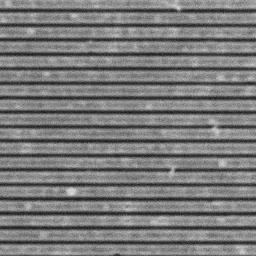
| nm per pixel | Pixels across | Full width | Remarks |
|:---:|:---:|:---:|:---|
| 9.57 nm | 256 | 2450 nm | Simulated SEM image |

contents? parallel lines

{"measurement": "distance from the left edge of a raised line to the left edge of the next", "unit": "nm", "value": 139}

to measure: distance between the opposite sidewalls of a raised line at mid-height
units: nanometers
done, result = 92.2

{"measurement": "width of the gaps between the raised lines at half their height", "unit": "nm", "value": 45.5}